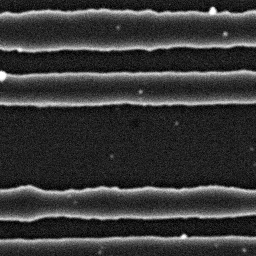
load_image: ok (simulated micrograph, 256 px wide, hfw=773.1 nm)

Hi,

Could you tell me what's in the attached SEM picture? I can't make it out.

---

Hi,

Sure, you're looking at lines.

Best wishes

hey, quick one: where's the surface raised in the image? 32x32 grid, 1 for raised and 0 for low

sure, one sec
00000000000000000000000000000000
00011111111111111110000110100001
11111111111111111111111111111111
11111111111111111111111111111111
11111111111111111111111111111111
11111111111111111111111111111111
00000000000000000000000000000000
00000000000000000000000000000000
00000000000000000000000000000000
11011111111111111111111111111111
11111111111111111111111111111111
11111111111111111111111111111111
11111111111111111111111111111111
00000000000000000000000000000000
00000000000000000000000000000000
00000000000000000000000000000000
00000000000000000000000000000000
00000000000000000000000000000000
00000000000000000000000000000000
00000000000000000000000000000000
00000000000000000000000000000000
00000000000000000000000000000000
00000000000000000000000000000000
00111000000011100011000011111100
11111111111111111111111111111111
11111111111111111111111111111111
11111111111111111111111111111111
00110000000000000000000000000000
00000000000000000000000000000000
00000000000000000000000000000000
11111111111111111111111111111111
11111111111111111111111111111111